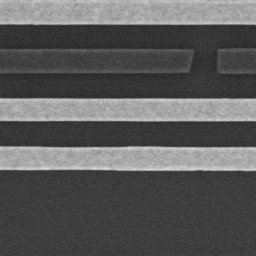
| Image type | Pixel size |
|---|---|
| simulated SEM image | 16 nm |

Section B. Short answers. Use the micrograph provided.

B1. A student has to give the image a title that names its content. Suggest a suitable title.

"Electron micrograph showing wiring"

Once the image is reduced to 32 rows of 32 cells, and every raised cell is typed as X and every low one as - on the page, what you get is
XXXXXXXXXXXXXXXXXXXXXXXXXXXXXXXX
XXXXXXXXXXXXXXXXXXXXXXXXXXXXXXXX
XXXXXXXXXXXXXXXXXXXXXXXXXXXXXXXX
--------------------------------
--------------------------------
--------------------------------
XXXXXXXXXXXXXXXXXXXXXXXX---XXXXX
XXXXXXXXXXXXXXXXXXXXXXXX---XXXXX
XXXXXXXXXXXXXXXXXXXXXXXX---XXXXX
--------------------------------
--------------------------------
--------------------------------
XXXXXXXXXXXXXXXXXXXXXXXXXXXXXXXX
XXXXXXXXXXXXXXXXXXXXXXXXXXXXXXXX
XXXXXXXXXXXXXXXXXXXXXXXXXXXXXXXX
--------------------------------
--------------------------------
--------------------------------
XXXXXXXXXXXXXXXXXXXXXXXXXXXXXXXX
XXXXXXXXXXXXXXXXXXXXXXXXXXXXXXXX
XXXXXXXXXXXXXXXXXXXXXXXXXXXXXXXX
--------------------------------
--------------------------------
--------------------------------
--------------------------------
--------------------------------
--------------------------------
--------------------------------
--------------------------------
--------------------------------
--------------------------------
--------------------------------